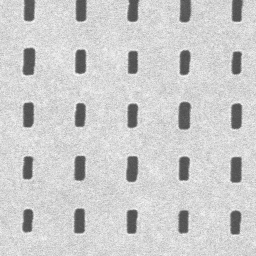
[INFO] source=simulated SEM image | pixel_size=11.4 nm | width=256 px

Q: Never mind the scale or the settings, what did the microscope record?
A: a regular array of holes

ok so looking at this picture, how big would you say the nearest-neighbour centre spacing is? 0.591 micrometres